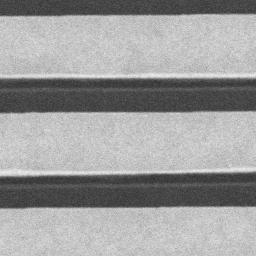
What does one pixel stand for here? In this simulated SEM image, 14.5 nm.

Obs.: lines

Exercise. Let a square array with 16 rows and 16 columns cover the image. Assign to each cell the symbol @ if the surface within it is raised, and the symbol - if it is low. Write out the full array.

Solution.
----------------
@@@@@@@@@@@@@@@@
@@@@@@@@@@@@@@@@
@@@@@@@@@@@@@@@@
@@@@@@@@@@@@@@@@
----------------
----------------
@@@@@@@@@@@@@@@@
@@@@@@@@@@@@@@@@
@@@@@@@@@@@@@@@@
@@@@@@@@@@@@@@@@
----------------
----------------
@@@@@@@@@@@@@@@@
@@@@@@@@@@@@@@@@
@@@@@@@@@@@@@@@@